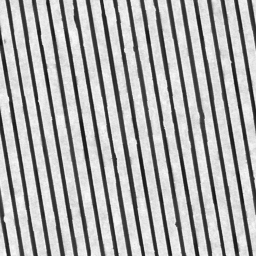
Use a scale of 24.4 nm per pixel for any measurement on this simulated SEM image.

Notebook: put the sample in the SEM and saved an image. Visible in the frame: parallel lines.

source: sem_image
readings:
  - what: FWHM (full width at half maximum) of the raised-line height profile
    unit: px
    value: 9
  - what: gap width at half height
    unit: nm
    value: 87.4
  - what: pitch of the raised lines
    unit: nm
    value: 324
